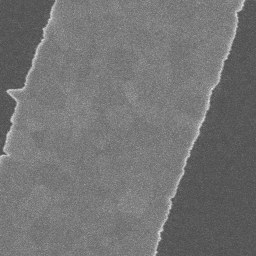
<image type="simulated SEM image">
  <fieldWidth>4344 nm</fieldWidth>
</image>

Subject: one or a few lines or trenches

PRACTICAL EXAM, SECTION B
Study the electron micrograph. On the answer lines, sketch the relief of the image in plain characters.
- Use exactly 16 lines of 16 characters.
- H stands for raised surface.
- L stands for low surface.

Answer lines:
LLLHHHHHHHHHHHHL
LLLHHHHHHHHHHHHL
LLLHHHHHHHHHHHHL
LLHHHHHHHHHHHHLL
LLHHHHHHHHHHHHLL
LHHHHHHHHHHHHLLL
LHHHHHHHHHHHHLLL
LHHHHHHHHHHHHLLL
HHHHHHHHHHHHLLLL
HHHHHHHHHHHHLLLL
HHHHHHHHHHHHLLLL
HHHHHHHHHHHLLLLL
HHHHHHHHHHHLLLLL
HHLHHHHHHHLLLLLL
HHHHHHHHHHLLLLLL
HHLHHHHHHHLLLLLL